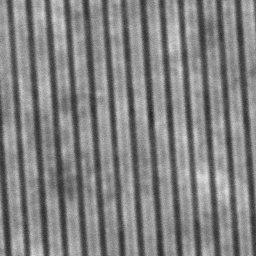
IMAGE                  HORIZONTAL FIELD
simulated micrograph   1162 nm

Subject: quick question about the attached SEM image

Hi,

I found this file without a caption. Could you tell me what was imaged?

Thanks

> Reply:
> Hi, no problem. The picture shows parallel lines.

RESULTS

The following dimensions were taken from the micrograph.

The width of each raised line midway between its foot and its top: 50.4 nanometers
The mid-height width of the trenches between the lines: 34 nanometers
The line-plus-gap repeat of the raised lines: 86.2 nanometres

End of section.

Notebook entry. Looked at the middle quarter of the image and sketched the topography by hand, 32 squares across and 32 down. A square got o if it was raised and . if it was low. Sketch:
o..oo...oo..ooo..ooo..ooo..oo..o
o..oo...oo..ooo..ooo..ooo..oo...
o..ooo..oo..ooo..ooo..ooo..oo...
o..ooo..oo...oo..ooo..ooo..oo...
o..ooo..ooo..oo..ooo..ooo..oo...
o..ooo..ooo..oo...oo..ooo..ooo..
o..ooo..ooo..oo...oo..ooo..ooo..
o..ooo..ooo..oo...oo..ooo..ooo..
o..ooo..ooo..oo...oo..ooo..ooo..
o..ooo..ooo..ooo..oo..ooo..ooo..
oo..oo..ooo..ooo..oo..ooo..ooo..
oo..oo..ooo..ooo..ooo..oo..ooo..
oo..oo...oo..ooo..ooo..oo..ooo..
oo..oo...oo..ooo..ooo..oo...oo..
oo..ooo..oo..ooo..ooo..ooo..oo..
oo..ooo..oo..ooo..ooo..ooo..oo..
oo..ooo..oo..ooo..ooo..ooo..oo..
oo..ooo..oo...oo..ooo..ooo..oo..
oo..ooo..ooo..oo..ooo..ooo..oo..
oo..ooo..ooo..oo...oo..ooo..ooo.
oo..ooo..ooo..oo...oo..ooo..ooo.
oo..ooo..ooo..ooo..oo..ooo..ooo.
oo..ooo..ooo..ooo..oo..ooo..ooo.
oo..ooo..ooo..ooo..oo..ooo..ooo.
ooo..oo..ooo..ooo..oo..ooo..ooo.
ooo..oo..ooo..ooo..ooo..oo..ooo.
ooo..oo...oo..ooo..ooo..oo..ooo.
ooo..oo...oo..ooo..ooo..oo...oo.
ooo..oo...oo..ooo..ooo..ooo..oo.
ooo..oo...oo..ooo..ooo..ooo..oo.
ooo..ooo..oo..ooo..ooo..ooo..oo.
ooo..ooo..oo...oo..ooo..ooo..oo.